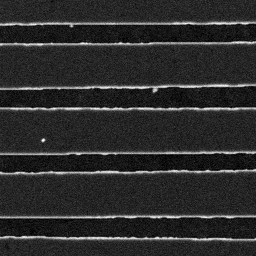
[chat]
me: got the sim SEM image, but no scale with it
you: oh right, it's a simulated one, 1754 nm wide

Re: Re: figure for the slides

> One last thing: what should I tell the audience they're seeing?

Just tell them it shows lines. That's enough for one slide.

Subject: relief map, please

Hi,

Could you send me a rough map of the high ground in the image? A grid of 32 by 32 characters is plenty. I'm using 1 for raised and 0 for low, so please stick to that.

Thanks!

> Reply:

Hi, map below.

11111111111111111111111111111111
11111111111111111111111111111111
11111111111111111111111111111111
00000000000000000000000000000000
00000000000000000000000000000000
00000010001000110011111111111111
11111111111111111111111111111111
11111111111111111111111111111111
11111111111111111111111111111111
11111111111111111111111111111111
11111111111111111111111111111111
00000000000000000000000000000000
00000000000000000000000000000000
00000000000000000000000000000000
11111111111111111111111111111111
11111111111111111111111111111111
11111111111111111111111111111111
11111111111111111111111111111111
11111111111111111111111111111111
00000000000000000000000000000000
00000000000000000000000000000000
00000000000011100111111111111111
11111111111111111111111111111111
11111111111111111111111111111111
11111111111111111111111111111111
11111111111111111111111111111111
11111111111111111111111111111111
00000000000000000000000000000000
00000000000000000000000000000000
00000000000000000000000000000000
11111111111111111111111111111111
11111111111111111111111111111111